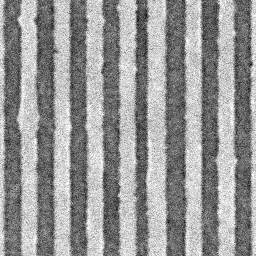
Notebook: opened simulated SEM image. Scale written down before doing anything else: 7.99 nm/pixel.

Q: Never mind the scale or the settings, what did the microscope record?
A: parallel lines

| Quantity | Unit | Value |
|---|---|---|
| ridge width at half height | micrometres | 0.12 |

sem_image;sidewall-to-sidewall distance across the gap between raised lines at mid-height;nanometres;141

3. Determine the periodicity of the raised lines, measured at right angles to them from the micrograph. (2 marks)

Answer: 0.263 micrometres